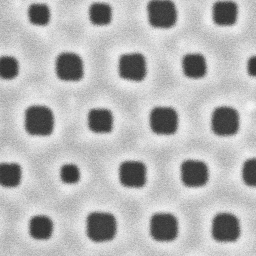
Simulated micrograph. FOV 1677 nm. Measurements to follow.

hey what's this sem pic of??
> a regular array of holes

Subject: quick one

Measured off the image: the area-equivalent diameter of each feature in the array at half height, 205 nm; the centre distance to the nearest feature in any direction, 401 nm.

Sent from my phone